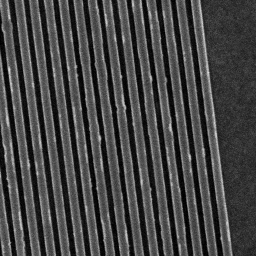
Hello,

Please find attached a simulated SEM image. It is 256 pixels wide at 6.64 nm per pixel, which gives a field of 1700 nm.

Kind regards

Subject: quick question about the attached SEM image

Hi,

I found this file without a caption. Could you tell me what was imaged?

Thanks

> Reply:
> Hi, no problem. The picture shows parallel lines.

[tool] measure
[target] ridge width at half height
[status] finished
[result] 59.2 nm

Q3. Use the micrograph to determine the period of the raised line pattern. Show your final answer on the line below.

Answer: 97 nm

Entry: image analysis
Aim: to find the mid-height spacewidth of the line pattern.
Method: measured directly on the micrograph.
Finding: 5.83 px